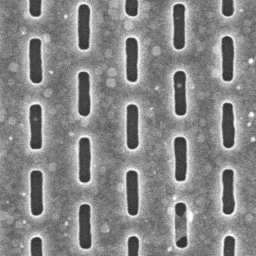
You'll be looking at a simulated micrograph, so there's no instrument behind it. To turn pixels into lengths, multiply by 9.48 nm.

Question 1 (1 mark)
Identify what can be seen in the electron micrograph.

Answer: a regular array of holes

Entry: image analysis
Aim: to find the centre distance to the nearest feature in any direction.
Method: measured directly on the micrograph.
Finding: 547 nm